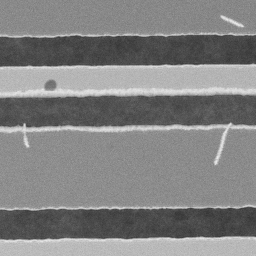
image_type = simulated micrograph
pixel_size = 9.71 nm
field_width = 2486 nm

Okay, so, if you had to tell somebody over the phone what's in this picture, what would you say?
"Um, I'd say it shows lines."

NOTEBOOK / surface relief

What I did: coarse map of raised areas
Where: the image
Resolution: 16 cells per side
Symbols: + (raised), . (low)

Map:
++++++++++++++++
++++++++++++++++
................
................
++++++++++++++++
++++++++++++++++
................
................
++++++++++++++++
++++++++++++++++
++++++++++++++++
++++++++++++++++
++++++++++++++++
................
................
++++++++++++++++